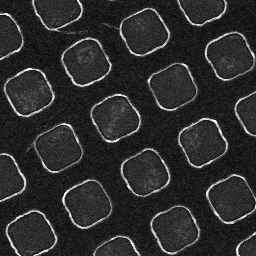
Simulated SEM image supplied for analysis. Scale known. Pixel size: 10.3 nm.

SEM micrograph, a regular array of holes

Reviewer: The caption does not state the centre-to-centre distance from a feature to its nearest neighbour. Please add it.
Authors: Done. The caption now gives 646 nm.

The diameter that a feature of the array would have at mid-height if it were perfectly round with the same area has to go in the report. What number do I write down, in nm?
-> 447